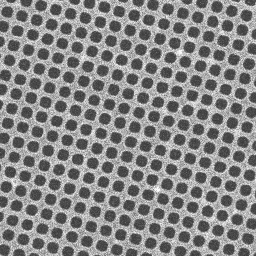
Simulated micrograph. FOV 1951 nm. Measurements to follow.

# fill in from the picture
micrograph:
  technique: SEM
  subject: a regular array of holes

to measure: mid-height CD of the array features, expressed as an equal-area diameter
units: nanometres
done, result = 93.8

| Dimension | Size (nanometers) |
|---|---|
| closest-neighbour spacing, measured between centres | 116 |